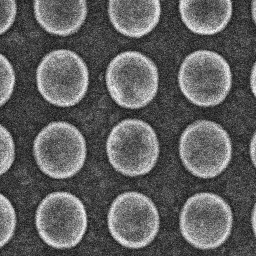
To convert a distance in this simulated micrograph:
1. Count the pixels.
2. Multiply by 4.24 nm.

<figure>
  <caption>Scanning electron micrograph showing a regular array of raised bodies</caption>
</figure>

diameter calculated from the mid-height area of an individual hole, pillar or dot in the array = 219 nanometers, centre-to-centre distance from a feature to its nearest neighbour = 297 nm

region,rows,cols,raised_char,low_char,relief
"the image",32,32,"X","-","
XX--XXXXXXX---XXXXXX---XXXXXX---
XX---XXXXXX---XXXXXX---XXXXXX---
XX---XXXXX----XXXXXX---XXXXX----
X-----XXX------XXXX-----XXXX----
--------------------------------
--------------------------------
-------XX----------------X------
X-----XXXX----XXXX-----XXXXX----
X----XXXXXX---XXXXX----XXXXX----
XX---XXXXXX--XXXXXX---XXXXXXX---
XX---XXXXXX--XXXXXXX---XXXXXX---
X----XXXXX----XXXXX----XXXXX----
X-----XXXX-----XXXX-----XXXX----
--------------------------------
--------------------------------
-------X-------XXX-------XX-----
X----XXXXX----XXXXX----XXXXX----
X----XXXXX----XXXXX----XXXXX----
XX--XXXXXXX---XXXXXX---XXXXXX--X
XX---XXXXXX---XXXXXX---XXXXXX--X
X----XXXXX----XXXXX----XXXXX----
------XXX------XXX------XXX-----
--------------------------------
--------------------------------
------XXX------XXX-------XX-----
X----XXXXX----XXXXX----XXXXX----
XX---XXXXX----XXXXXX---XXXXXX---
XX---XXXXXX---XXXXXX---XXXXXX---
XX---XXXXXX---XXXXXX---XXXXXX---
X----XXXXX----XXXXX----XXXXX----
------XXX-------XX------XXX-----
--------------------------------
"